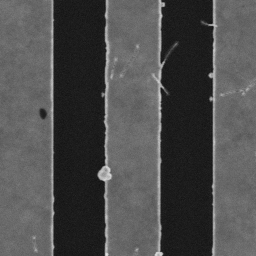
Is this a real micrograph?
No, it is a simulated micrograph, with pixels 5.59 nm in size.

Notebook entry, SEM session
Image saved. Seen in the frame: lines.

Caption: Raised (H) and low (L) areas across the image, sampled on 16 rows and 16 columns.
HHHLLLLHHHLLLHHH
HHHLLLLHHHLLLHHH
HHHLLLLHHHLLLHHH
HHHLLLLHHHLLLHHH
HHHLLLLHHHLLLHHH
HHHLLLLHHHLLLHHH
HHHLLLLHHHLLLHHH
HHHLLLLHHHLLLHHH
HHHLLLLHHHLLLHHH
HHHLLLLHHHLLLHHH
HHHLLLHHHHLLLHHH
HHHLLLHHHHLLLHHH
HHHLLLLHHHLLLHHH
HHHLLLLHHHLLLHHH
HHHLLLLHHHLLLHHH
HHHLLLLHHHLLLHHH